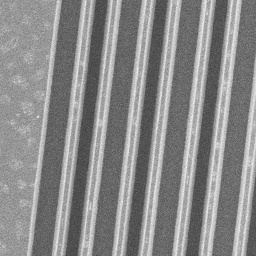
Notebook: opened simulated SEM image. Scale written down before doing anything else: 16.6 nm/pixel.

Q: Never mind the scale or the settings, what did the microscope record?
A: parallel lines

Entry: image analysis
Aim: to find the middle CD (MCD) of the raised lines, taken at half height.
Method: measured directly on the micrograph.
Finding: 158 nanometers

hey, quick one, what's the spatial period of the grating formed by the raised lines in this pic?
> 0.486 micrometres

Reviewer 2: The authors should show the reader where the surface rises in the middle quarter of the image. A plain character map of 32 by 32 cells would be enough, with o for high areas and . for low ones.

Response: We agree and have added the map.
...ooo....oo......oo.....oo.....
...oo....ooo......oo.....oo.....
...oo....ooo......oo....ooo.....
...oo....oo.......oo....ooo.....
...oo....oo.......oo....oo......
..ooo....oo.......oo....oo......
..ooo....oo......ooo....oo......
..oo.....oo......ooo....oo......
..oo.....oo......oo.....oo......
..oo.....oo......oo.....oo......
..oo....ooo......oo....ooo......
..oo....ooo......oo....ooo......
..oo....ooo......oo....oo.......
..oo....oo.......oo....oo.......
.ooo....oo......ooo....oo......o
.ooo....oo......ooo....oo......o
.oo.....oo......oo.....oo......o
.oo.....oo......oo.....oo......o
.oo....ooo......oo.....oo......o
.oo....ooo......oo....ooo......o
.oo....ooo......oo....ooo......o
.oo....ooo......oo....oo.......o
ooo....oo.......oo....oo.......o
ooo....oo......ooo....oo......oo
ooo....oo......ooo....oo......oo
ooo....oo......oo.....oo......oo
oo.....oo......oo.....oo......oo
oo....ooo......oo....ooo......oo
oo....ooo......oo....ooo......oo
oo....ooo......oo....oo.......oo
oo....oo.......oo....oo.......oo
oo....oo......ooo....oo......ooo